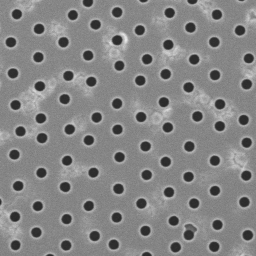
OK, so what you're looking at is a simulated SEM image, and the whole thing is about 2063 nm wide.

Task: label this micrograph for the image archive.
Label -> a regular array of holes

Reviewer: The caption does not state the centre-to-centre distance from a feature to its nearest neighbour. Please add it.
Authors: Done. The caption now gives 205 nm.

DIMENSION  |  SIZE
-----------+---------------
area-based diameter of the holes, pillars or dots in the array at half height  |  82.4 nm